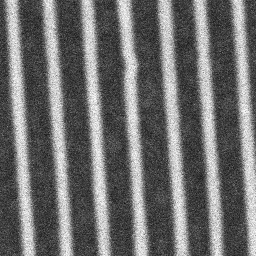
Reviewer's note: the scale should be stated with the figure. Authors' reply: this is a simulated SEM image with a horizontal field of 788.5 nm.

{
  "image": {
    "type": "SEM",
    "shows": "parallel lines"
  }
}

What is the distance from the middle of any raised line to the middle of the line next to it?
116 nm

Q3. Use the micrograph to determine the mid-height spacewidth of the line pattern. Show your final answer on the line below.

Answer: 86.3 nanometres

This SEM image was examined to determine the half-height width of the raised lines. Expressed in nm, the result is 29.9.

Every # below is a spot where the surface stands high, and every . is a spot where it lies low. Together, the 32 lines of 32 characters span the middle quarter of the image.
......##........##.......##.....
......##........##.......###....
......##.......###.......###....
......##.......###.......###....
......##.......###.......###....
......##.......###.......###....
......##.......###.......###....
......##.......###.......###....
......###.......##........##....
......###.......##........##....
......###.......##........##....
.......##.......##........##....
.......##.......##........###...
.......##.......##........###...
.......##.......##........##....
.......##.......###.......##....
.......##.......###.......###...
.......##.......###.......###...
.......##........##.......###...
.......##........##.......###...
.......##........##.......###...
.......##........##.......###...
.......###.......##.......###...
.......###.......##........##...
.......###.......##........##...
.......###.......##........##...
.......###.......##........##...
.......###.......##........##...
.......###.......##........##...
#.......##.......##........##...
#.......##.......##........###..
#.......##.......##........###..